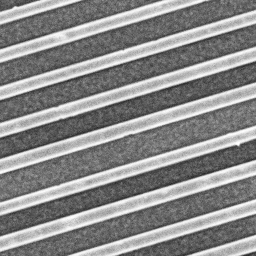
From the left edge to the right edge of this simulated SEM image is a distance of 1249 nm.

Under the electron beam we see parallel lines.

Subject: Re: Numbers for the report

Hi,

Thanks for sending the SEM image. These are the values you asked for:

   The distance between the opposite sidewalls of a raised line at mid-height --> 12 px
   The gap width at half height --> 0.117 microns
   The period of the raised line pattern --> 177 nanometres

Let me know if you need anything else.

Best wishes